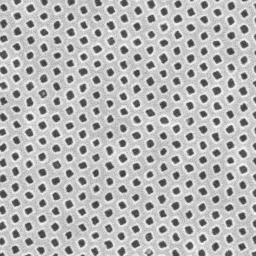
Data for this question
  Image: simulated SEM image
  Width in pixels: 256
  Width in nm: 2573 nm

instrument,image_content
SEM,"a regular array of holes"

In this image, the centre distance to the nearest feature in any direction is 150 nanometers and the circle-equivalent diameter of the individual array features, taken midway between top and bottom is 84.1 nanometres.